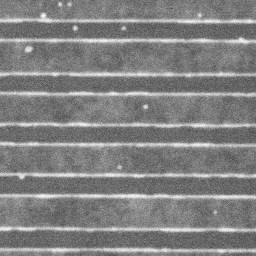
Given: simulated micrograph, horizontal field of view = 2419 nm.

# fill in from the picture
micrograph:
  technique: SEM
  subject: lines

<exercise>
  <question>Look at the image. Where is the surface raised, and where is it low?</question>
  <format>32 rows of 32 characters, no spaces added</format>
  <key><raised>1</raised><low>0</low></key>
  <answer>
11111111111111111111111111111111
11111111111111111111111111111111
11100111111111111111111111111111
00000000000000000000000000000000
00000000000000000000000000000000
11111111111111111111111111111111
11111111111111111111111111111111
11111111111111111111111111111111
11111111111111111111111111111111
00000000000000000000000000000000
00000000000000000000000000000000
00000000000000000000000000000000
11111111111111111111111111111111
11111111111111111111111111111111
11111111111111111111111111111111
11111111111111111111111111111111
00000000000000000000000000000000
00000000000000000000000000000000
11111111111111111111111111111111
11111111111111111111111111111111
11111111111111111111111111111111
11111111111111111111111111111111
00000000000000000000000000000000
00000000000000000000000000000000
11111111111111111101100000000000
11111111111111111111111111111111
11111111111111111111111111111111
11111111111111111111111111111111
11111111111111111111111111111111
00000000000000000000000000000000
00000000000000000000000000000000
11111111111111111111111111111111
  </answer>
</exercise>